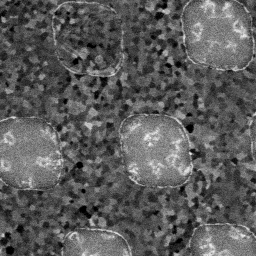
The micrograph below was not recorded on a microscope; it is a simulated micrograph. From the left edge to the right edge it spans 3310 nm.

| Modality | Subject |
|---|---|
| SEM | holes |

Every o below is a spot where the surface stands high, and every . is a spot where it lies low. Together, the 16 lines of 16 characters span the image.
oooo...ooooo...o
ooo.....ooo.....
ooo.....oooo....
oooo....oooo....
ooooo..ooooooooo
oooooooooooooooo
oooooooooooooooo
...ooooo...ooooo
....oooo....oooo
....oooo....oooo
....oooo....oooo
...oooooo..ooooo
oooooooooooooooo
oooooooooooooooo
ooooo..ooooo....
oooo....oooo....